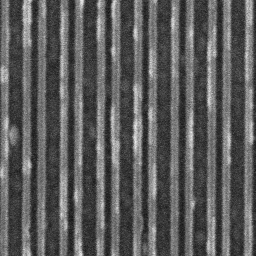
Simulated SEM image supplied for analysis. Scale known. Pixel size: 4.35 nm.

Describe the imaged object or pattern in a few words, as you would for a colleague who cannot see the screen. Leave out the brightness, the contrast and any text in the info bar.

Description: parallel lines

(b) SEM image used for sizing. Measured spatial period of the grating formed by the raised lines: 81.7 nm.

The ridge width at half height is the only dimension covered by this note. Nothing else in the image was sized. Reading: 25 nm